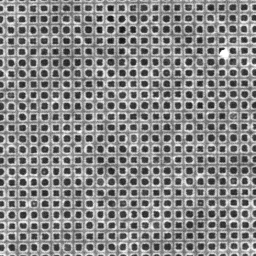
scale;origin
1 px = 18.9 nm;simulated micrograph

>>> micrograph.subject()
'a regular array of holes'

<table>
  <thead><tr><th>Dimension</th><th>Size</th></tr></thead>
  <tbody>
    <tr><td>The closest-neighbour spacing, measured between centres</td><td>10.6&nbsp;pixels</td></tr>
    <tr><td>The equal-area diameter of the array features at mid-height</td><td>152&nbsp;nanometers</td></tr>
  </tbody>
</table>